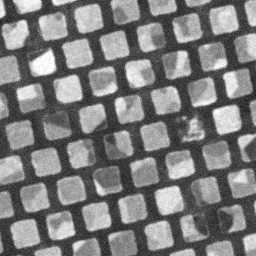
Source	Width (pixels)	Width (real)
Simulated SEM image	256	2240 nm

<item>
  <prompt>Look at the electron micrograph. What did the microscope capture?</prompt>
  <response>a regular array of raised bodies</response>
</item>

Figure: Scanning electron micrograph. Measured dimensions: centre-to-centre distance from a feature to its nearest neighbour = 0.324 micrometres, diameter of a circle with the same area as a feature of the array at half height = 244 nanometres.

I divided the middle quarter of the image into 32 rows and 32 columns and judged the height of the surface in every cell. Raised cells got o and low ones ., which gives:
.ooo...........ooooooo...oooooo.
........oooo....oooooo...ooooooo
......ooooooo...oooooo....ooooo.
.oo...ooooooo...oooooo....o.....
oooo...oooooo...oooooo..........
oo.o...oooooo....oo............o
oooo...oooooo..........ooooo...o
oooo....oo............oooooo...o
oooo..........ooooo...ooooooo...
o............oo.ooo...ooooooo...
.......ooo...oooooo....oooooo...
....oooooo...ooooooo...oooooo...
o...oooooo...ooooooo....o.......
o...oooooo....oooooo............
o...ooooooo...oo................
o...ooooooo..........oooo.......
oo...oooo..........ooooooo......
oo..........oooo....oooooo......
..........oo..oo....oooooo......
...oooo...ooo.ooo...oooooo......
.oooooo...ooooooo...oooooo......
.oooooo....oooooo....o..........
.ooooooo...oooooo..........oooo.
.ooooooo...ooo............oooooo
..oooooo..........ooooo...oooooo
..ooo............oooooo...oooooo
.........ooooo...oooooo...oooooo
........oooooo...oooooo...oooooo
.ooo....oooooo...oooooo....o....
oooo....oooooo....ooooo.........
ooooo...oooooo....o.............
ooooo...oooooo..........ooooo...